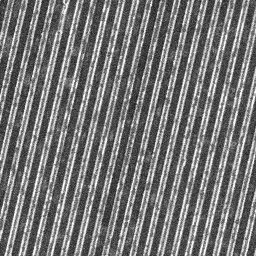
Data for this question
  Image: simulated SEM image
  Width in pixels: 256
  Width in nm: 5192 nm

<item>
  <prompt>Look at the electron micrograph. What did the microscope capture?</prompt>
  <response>parallel lines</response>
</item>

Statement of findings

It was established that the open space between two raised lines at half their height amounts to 175 nm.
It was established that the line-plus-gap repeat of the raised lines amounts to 274 nm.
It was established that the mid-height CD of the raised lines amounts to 98.8 nanometres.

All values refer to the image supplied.